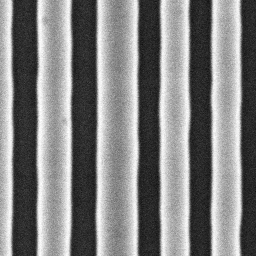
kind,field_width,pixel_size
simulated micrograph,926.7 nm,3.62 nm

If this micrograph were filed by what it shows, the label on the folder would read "groups of lines, slits or small figures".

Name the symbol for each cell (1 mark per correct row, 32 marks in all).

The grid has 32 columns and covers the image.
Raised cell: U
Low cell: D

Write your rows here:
UDDDDUUUUDDDUUUUUDDDUUUDDDDUUUDD
UDDDDUUUUDDDUUUUUDDDUUUDDDDUUUDD
UDDDDUUUUDDDUUUUUDDDUUUDDDDUUUDD
UDDDDUUUUDDDUUUUUDDDUUUDDDDUUUDD
UDDDDUUUUDDDUUUUUDDDUUUDDDDUUUDD
UDDDDUUUUDDDUUUUUDDDUUUDDDDUUUDD
UDDDDUUUUDDDUUUUUDDDUUUDDDDUUUDD
UDDDDUUUUDDDUUUUUDDDUUUDDDDUUUDD
UDDDDUUUUDDDUUUUUDDDUUUDDDDUUUDD
UDDDDUUUUDDDUUUUUDDDUUUDDDDUUUDD
UDDDDUUUUDDDUUUUUDDDUUUDDDDUUUDD
UDDDDUUUUDDDUUUUUDDDUUUDDDUUUUDD
UDDDDUUUUDDDUUUUUDDDUUUUDDUUUUDD
UDDDDUUUUDDDUUUUUDDDUUUUDDDUUUDD
UDDDDUUUUDDDUUUUUDDDUUUUDDDUUUDD
UDDDDUUUUDDDUUUUUDDDUUUUDDDUUUDD
UDDDDUUUUDDDUUUUUDDDUUUDDDDUUUDD
UDDDDUUUUDDDUUUUUDDDUUUDDDDUUUDD
UDDDDUUUUDDDUUUUUDDDUUUDDDDUUUDD
UDDDDUUUUDDDUUUUUDDDUUUDDDDUUUDD
UDDDDUUUUDDDUUUUUDDDUUUDDDDUUUDD
UDDDDUUUUDDDUUUUUDDDUUUDDDDUUUDD
UDDDDUUUUDDDUUUUUDDDUUUDDDDUUUDD
UDDDDUUUUDDDUUUUUDDDUUUDDDDUUUDD
UDDDDUUUUDDDUUUUUDDDUUUDDDDUUUDD
UDDDDUUUUDDDUUUUUDDDUUUDDDUUUUDD
UDDDDUUUUDDDUUUUUDDDUUUDDDUUUUDD
UDDDDUUUUDDDUUUUUDDDUUUDDDUUUUDD
UDDDDUUUUDDDUUUUUDDDUUUDDDDUUUDD
UDDDDUUUUDDDUUUUUDDDUUUDDDDUUUDD
UDDDDUUUUDDDUUUUUDDDUUUUDDDUUUDD
UDDDDUUUUDDDUUUUUDDDUUUUDDDUUUDD